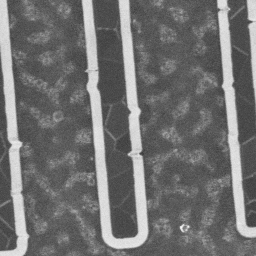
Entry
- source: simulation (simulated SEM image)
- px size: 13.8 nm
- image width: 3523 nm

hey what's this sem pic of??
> one or a few lines or trenches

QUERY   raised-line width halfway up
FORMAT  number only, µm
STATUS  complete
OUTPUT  0.502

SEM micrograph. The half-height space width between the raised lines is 1190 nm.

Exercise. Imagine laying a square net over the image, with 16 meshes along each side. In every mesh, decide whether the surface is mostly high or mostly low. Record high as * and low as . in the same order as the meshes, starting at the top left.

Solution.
.....***......**
......**......**
......**......**
......**......**
......**......**
*.....**......**
*.....**......**
*.....**.......*
*.....**.......*
*.....***......*
*.....***......*
*.....***......*
*.....***......*
*......**......*
*......**.......
*...............